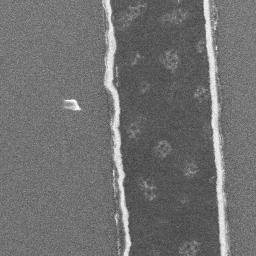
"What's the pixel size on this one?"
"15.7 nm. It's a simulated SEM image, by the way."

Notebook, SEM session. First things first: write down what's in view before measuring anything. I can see one or a few lines or trenches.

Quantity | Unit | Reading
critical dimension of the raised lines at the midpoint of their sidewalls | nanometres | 1550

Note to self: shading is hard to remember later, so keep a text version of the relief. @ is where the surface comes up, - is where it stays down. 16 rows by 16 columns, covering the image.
-------@@@@@@---
-------@@@@@@---
-------@@@@@@---
-------@@@@@@---
-------@@@@@@---
-------@@@@@@---
-------@@@@@@---
-------@@@@@@---
-------@@@@@@@--
-------@@@@@@@--
-------@@@@@@@--
--------@@@@@@--
--------@@@@@@--
--------@@@@@@--
--------@@@@@@--
--------@@@@@@--